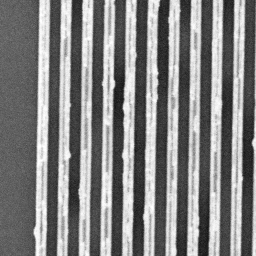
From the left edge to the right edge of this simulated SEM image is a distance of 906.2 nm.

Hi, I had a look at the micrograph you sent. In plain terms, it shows parallel lines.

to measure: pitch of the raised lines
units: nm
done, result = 76.7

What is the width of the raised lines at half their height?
28.3 nm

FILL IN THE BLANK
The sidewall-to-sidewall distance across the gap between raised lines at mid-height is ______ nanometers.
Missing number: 49.5